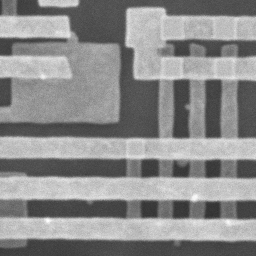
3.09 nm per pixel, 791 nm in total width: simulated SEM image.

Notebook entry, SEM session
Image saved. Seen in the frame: wiring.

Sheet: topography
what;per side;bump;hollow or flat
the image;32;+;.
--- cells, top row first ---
.....+++++......................
................+++++...........
+++++++++.......++++++++++++++++
+++++++++.......++++++++++++++++
+++++++++.......++++++++++++++++
................+++++...........
.................+++............
++++++++.........+++++++++++++++
+++++++++........+++++++++++++++
+++++++++........+++++++++++++++
................................
................................
................................
................................
................................
................................
................................
++++++++++++++++++++++++++++++++
++++++++++++++++++++++++++++++++
++++++++++++++++++++++++++++++++
................................
................................
++++++++++++++++++++++++++++++++
++++++++++++++++++++++++++++++++
++++++++++++++++++++++++++++++++
................................
................................
++++++++++++++++++++++++++++++++
++++++++++++++++++++++++++++++++
++++++++++++++++++++++++++++++++
................................
................................